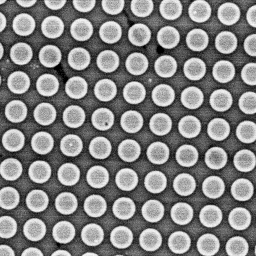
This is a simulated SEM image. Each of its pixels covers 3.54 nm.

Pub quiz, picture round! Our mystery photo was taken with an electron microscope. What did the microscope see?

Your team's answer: an array of small figures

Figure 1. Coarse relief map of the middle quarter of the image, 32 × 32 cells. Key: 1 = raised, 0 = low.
00111100011110001111100111110011
00000000011110001111000111110011
00000000000000000110000111100011
00110000000000000000000000000001
01111000011100000000000000000000
11111100111110011111000111000000
11111100111110011111001111100011
01111000111110011111001111110111
00110000111100011111001111110111
00000000000000001110000111100111
00100000000000000000000000000011
11111000111000000000000000000000
11111001111100011110000110000000
11111001111100111110001111000011
11111001111100111111011111100111
01110000111100111110001111100111
00000000000000011110001111100111
00000000000000000000000110000111
11110000110000000000000000000000
11110001111000011100000000000000
11111011111100111110011111000111
11110011111100111110011111001111
11110001111000111110011111001111
00000000110000111100011111001111
00000000000000000000001110001111
11100000000000000000000000000011
11110011111000111000000000000000
11110011111001111100011110000100
11110011111001111100111110001111
11100011111001111100111111011111
00000001110001111100111110011111
00000000000000011000011110001111